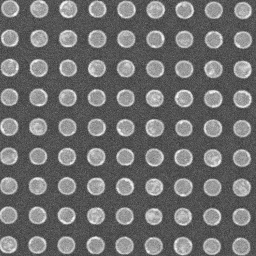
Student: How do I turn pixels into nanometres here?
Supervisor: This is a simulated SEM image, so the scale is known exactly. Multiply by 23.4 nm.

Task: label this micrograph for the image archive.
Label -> a regular array of raised bodies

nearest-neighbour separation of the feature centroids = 29 pixels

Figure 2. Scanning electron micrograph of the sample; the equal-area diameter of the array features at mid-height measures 396 nm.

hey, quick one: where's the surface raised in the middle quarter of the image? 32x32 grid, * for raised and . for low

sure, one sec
***...****....***....****...****
***...****....***....****...****
**.....***....***....***....****
................................
................................
................................
................................
***...****....***....***....****
***...****...****....****...****
***...****....***....****...****
.............................**.
................................
................................
................................
***....***....***....***.....**.
***...****...****....****...****
***...****...****....****...****
**.....**.....***....***.....**.
................................
................................
................................
**.....**.....**.....***.....**.
***...****...****....****...****
***...****...****....****...****
***...****....***....***....****
................................
................................
................................
................................
***...****....***....***....****
***...****...****....****...****
***...****...****....***....****